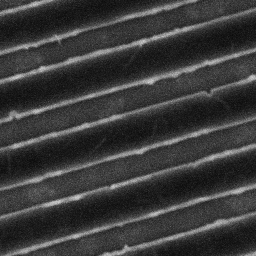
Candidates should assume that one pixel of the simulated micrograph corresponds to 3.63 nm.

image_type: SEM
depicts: one or a few lines or trenches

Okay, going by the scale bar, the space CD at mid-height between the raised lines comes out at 85.2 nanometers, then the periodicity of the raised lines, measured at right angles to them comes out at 238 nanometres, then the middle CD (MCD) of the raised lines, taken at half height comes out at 152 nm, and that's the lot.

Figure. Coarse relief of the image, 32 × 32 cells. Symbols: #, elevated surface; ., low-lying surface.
....###################.........
####################..........##
################...........#####
############...........#########
#########..........#############
#####...........################
#...........####################
........####################....
.....####################.......
..####################.........#
###################..........###
##############...........#######
##########............##########
#######...........##############
###...........##################
..........####################..
.......###################......
....###################.........
###################...........##
################..........######
############............########
########............############
#####...........################
#............###################
.........###################....
......##################........
..###################...........
#################..........#####
##############...........#######
##########............##########
#######...........##############
####..........##################